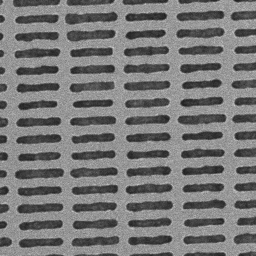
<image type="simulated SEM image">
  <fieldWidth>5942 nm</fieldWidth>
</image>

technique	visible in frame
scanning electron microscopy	a regular array of holes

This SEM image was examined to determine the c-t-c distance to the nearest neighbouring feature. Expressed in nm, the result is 396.